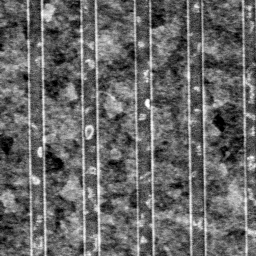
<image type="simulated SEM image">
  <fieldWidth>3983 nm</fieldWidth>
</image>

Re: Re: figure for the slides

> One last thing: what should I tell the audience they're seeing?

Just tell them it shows parallel lines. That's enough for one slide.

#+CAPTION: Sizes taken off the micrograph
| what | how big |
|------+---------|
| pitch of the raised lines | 834 nm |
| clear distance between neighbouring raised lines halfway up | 228 nm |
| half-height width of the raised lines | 607 nm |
